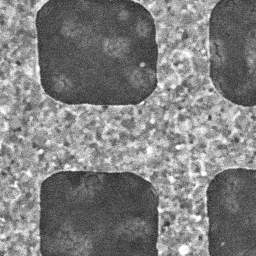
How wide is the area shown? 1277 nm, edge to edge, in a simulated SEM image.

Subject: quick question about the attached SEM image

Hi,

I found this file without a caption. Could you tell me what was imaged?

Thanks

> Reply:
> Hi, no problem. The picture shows holes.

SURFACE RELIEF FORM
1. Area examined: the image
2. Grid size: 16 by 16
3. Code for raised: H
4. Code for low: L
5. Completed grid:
HHHLLLLLLHHHHLLL
HHLLLLLLLLHHHLLL
HHLLLLLLLLHHHLLL
HHLLLLLLLLHHHLLL
HHLLLLLLLLHHHLLL
HHHLLLLLLLHHHLLL
HHHHLLLLLHHHHHHL
HHHHHHHHHHHHHHHH
HHHHHHHHHHHHHHHH
HHHHHHHHHHHHHHHH
HHHHHHHHHHHHHHLH
HHHLLLLLLHHHHLLL
HHLLLLLLLLHHHLLL
HHLLLLLLLLHHHLLL
HHLLLLLLLLHHHLLL
HHLLLLLLLLHHHLLL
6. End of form